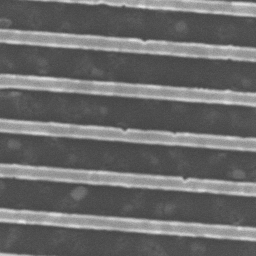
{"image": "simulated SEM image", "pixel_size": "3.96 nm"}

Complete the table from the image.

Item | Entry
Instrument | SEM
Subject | parallel lines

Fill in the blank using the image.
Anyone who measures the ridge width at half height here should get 47.3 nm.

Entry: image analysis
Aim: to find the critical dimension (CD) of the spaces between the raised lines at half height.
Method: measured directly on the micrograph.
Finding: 131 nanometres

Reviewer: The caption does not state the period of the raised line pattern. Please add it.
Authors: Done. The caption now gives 177 nanometers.